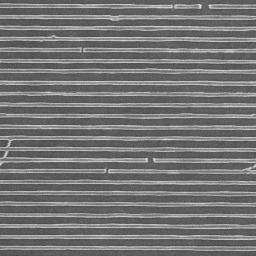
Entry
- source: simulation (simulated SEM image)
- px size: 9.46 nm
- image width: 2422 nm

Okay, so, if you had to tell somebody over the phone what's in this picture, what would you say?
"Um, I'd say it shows parallel lines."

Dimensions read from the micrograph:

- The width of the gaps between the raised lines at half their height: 73.4 nanometers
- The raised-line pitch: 104 nm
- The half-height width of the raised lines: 28.4 nanometers